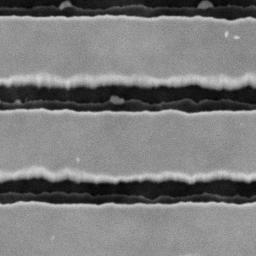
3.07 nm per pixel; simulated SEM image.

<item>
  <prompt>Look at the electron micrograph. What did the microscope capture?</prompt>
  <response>lines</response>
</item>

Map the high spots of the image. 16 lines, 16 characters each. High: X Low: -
----------------
XXXXXXXXXXXXXXXX
XXXXXXXXXXXXXXXX
XXXXXXXXXXXXXXXX
XXXXXXXXXXXXXXXX
--------------X-
----------------
XXXXXXXXXXXXXXXX
XXXXXXXXXXXXXXXX
XXXXXXXXXXXXXXXX
XXXXXXXXXXXXXXXX
----------------
----------------
XXXXXXXXXXXXXXXX
XXXXXXXXXXXXXXXX
XXXXXXXXXXXXXXXX